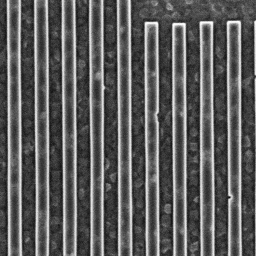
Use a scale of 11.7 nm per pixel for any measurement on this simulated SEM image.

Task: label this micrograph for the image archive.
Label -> parallel lines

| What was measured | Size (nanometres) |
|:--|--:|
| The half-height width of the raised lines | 138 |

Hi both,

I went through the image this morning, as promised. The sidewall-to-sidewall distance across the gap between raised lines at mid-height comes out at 178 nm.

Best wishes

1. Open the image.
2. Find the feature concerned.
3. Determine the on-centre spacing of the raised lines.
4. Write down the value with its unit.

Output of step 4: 0.32 micrometres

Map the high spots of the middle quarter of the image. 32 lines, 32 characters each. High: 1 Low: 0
11100001110000110000111000011100
11100001110000110000111000011100
11100001110000110000111000011100
11100001110000110000111000011100
11100001110000110000111000011100
11100001110000110000111000011100
11100001110000110000111000011100
11100001110000110000111000011100
11100001110000110000111000011100
11100001110000110000111000011100
11100001110000110000111000011100
11100001110000110000111000011100
11100001110000110000111000011100
11100001110000110000011000011100
11100001110000110000011000001100
11100001110000110000011000001100
11100001110000110000011000001100
11100001110000110000011000001100
11100001110000110000011000001100
11100001110000110000011000001100
11100001110000110000011000001100
11100001110000110000011000001100
11100001110000110000011000001100
11100001110000110000011000001100
11100001110000110000011000001100
11100001110000111000011000001100
11100001110000111000011000001100
11100001110000111000011000001100
11100001110000111000011000001100
11100001110000111000011100001100
11100001110000111000011100001100
11100001110000111000011100001100